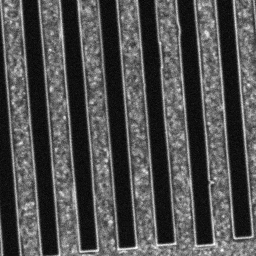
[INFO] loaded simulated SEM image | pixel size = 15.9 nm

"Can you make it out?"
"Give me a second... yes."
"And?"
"parallel lines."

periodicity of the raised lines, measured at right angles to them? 0.617 µm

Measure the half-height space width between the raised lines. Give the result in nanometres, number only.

317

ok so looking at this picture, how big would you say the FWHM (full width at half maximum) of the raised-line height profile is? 303 nanometres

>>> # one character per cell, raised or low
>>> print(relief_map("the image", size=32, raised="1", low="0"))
00011001110011100110001100011000
00011000110011100111001100011000
00011000110011100111001110011000
00011000110001100111001110011100
00011000110001100111001110011100
10011000110001100011001110011100
10011000110001100011000110011100
10011000110001100011000110001100
10011100110001100011000110001100
10011100111001100011000110001100
10011100111001110011000110001100
10011100111001110011000110001100
10001100111001110011000110001100
10001100011001110011100110001100
10001100011001110011100111001100
10001100011001110011100111001100
10001100011000110011100111001110
10001100011000110001100111001110
10001100011000110001100011001110
11001100011000110001100011001110
11001110011100110001100011000110
11001110011100110001100011000110
11001110011100110001100011000110
11001110011100110001100011000110
11000110011100111001110011000110
11000110001100111001110011000110
11000110001100111001110011000110
11000110001100111001110011100110
11000110001100011001110011100111
11000110001100011001110011100110
11000110001100011000110001100000
11100110000000000000000000000000